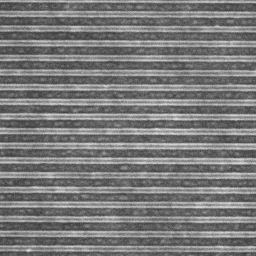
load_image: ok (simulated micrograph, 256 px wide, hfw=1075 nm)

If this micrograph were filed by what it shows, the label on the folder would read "parallel lines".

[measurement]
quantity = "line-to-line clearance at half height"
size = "40.4 nm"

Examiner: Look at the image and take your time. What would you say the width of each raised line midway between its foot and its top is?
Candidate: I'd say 22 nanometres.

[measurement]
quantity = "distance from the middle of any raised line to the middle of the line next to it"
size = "61.4 nm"